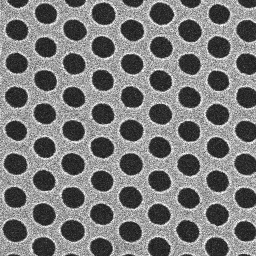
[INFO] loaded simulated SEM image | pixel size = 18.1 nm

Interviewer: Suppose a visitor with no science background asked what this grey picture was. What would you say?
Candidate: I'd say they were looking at a regular array of holes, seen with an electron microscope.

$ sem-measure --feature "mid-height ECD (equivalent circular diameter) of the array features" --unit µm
0.41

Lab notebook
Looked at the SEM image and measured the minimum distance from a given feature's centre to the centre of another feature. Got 0.598 microns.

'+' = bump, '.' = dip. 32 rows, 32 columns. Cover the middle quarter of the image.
.....+++++++++......+++++++++...
.....+++..+++++.....+++.+++++...
+...+++.....++++..++++....++++..
+++++++.....+++++++++......+++++
+++++++......++++++++......+++++
+++++++.....++++.+++++.....+++++
....+++++...+++....++++...+++...
.....+++++++++......+++++++++...
.....+++++++++......+++++++++...
.....+++++++++......+++++++++...
+...++++....+++....+++....++++..
+++++++.....+++++++++......+++++
+++++++......++++++++......+++++
+++++++......++++++++......+++++
....++++....+++....+++....++++..
.....+++++++++......+++++++++...
.....+++++++++......++++++++....
.....+++++++++......+++++++++...
.....+++...++++....+++...++++...
+++++++.....+++++++++.....+++++.
++++++.......++++++++......+++++
+++++++......++++++++......+++++
+..++++.....+++...++++....+++++.
.....++++..+++.....++++..++++...
.....+++++++++......++++++++....
.....+++++++++......++++++++....
.....+++++++++.....++++++++++...
+...+++.....+++....++.....++++..
+++++++.....+++++++++......+++++
+++++++......++++++++......+++++
+++++++.....+++++++++......+++++
....++++...+++.....++++...+++...